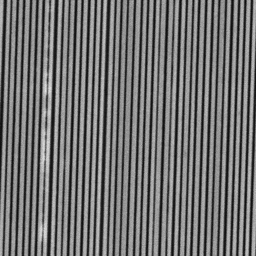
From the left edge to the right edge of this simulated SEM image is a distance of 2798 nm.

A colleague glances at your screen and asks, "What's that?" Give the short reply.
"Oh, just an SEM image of parallel lines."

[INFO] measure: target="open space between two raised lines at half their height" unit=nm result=20.5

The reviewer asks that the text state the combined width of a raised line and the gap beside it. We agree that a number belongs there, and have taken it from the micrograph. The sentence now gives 70.8 nm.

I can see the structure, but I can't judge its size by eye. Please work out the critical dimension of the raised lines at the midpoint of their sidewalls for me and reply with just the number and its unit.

3.75 pixels